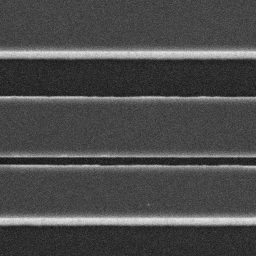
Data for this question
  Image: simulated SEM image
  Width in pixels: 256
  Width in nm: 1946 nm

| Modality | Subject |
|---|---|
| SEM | lines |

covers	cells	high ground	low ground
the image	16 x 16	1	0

1111111111111111
1111111111111111
1111111111111111
0000000000000000
0000000000000000
0000000000000000
1111111111111111
1111111111111111
1111111111111111
1111111111111111
1111111111111111
1111111111111111
1111111111111111
1111111111111111
0000000000000000
0000000000000000